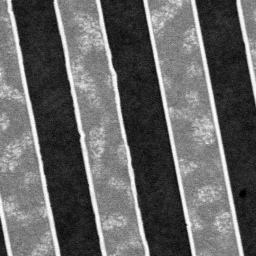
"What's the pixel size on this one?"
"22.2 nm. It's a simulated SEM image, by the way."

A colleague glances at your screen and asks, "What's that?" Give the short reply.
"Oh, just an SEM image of one or a few lines or trenches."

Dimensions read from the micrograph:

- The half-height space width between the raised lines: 1030 nm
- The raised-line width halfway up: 1030 nanometres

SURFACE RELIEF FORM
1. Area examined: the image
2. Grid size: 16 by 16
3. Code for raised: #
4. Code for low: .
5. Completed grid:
#...##...###...#
#...##...###...#
#...###...##...#
#...###...###...
#...###...###...
##...##...###...
##...##...###...
##...###..###...
##...###...###..
##...###...###..
###..###...###..
###...##...###..
###...##...###..
###...###...###.
###...###...###.
.###..###...###.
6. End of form